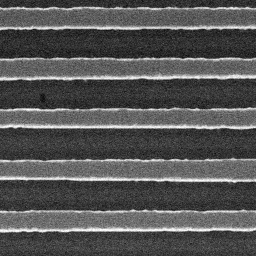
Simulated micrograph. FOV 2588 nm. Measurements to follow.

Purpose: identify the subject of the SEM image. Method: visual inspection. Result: lines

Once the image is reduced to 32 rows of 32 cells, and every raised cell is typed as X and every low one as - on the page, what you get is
--------------------------------
XXXXXXXXXXXXXXXXXXXXXXXXXXXXXXXX
XXXXXXXXXXXXXXXXXXXXXXXXXXXXXXXX
XXXXXXXXXXXXXXXXXXXXXXXXXXXXXXXX
--------------------------------
--------------------------------
--------------------------------
XXXXXXXXXXXXXXXXXXXXXXXXXXXXXXXX
XXXXXXXXXXXXXXXXXXXXXXXXXXXXXXXX
XXXXXXXXXXXXXXXXXXXXXXXXXXXXXXXX
--------------------------------
--------------------------------
--------------------------------
--------------------------------
XXXXXXXXXXXXXXXXXXXXXXXXXXXXXXXX
XXXXXXXXXXXXXXXXXXXXXXXXXXXXXXXX
--------------------------------
--------------------------------
--------------------------------
--------------------------------
XXXXXXXXXXXXXXXXXXXXXXXXXXXXXXXX
XXXXXXXXXXXXXXXXXXXXXXXXXXXXXXXX
---------XXXXXXXXXXXXXXXXXXXXXXX
--------------------------------
--------------------------------
--------------------------------
XX-XXXXXXXXXXXXXXXXXXXXXXXXXXXXX
XXXXXXXXXXXXXXXXXXXXXXXXXXXXXXXX
XXXXXXXXXXXXXXXXXXXXXXXXXXXXXXXX
--------------------------------
--------------------------------
--------------------------------